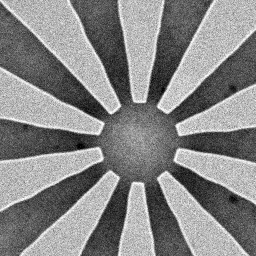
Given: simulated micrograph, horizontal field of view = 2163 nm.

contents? groups of lines, slits or small figures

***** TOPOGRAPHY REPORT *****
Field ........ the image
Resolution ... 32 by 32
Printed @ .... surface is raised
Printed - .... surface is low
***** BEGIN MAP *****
@@@@@@@@@------@@@@@------@@@@@@
-@@@@@@@@------@@@@@------@@@@@@
--@@@@@@@@-----@@@@@-----@@@@@@@
----@@@@@@-----@@@@@-----@@@@@@@
----@@@@@@@----@@@@@----@@@@@@@-
-----@@@@@@-----@@@@----@@@@@@--
------@@@@@@----@@@----@@@@@@---
-------@@@@@----@@@----@@@@@----
--------@@@@@---@@@---@@@@@-----
@@-------@@@@---@@@---@@@@------
@@@@------@@@@--@@@--@@@@-------
@@@@@@-----@@@--@@---@@@------@@
@@@@@@@-----@@@--@--@@@-----@@@@
@@@@@@@@@----@@-----@@----@@@@@@
@@@@@@@@@@@-------------@@@@@@@@
----@@@@@@@@@---------@@@@@@@@@@
---------@@@----------@@@-------
--------------------------------
--------------------------------
-----@@@@@@@@---------@@@@@@----
@@@@@@@@@@@@----------@@@@@@@@@@
@@@@@@@@@@--------------@@@@@@@@
@@@@@@@@----@@@-----@@----@@@@@@
@@@@@@------@@--@@--@@@-----@@@@
@@@@------@@@@--@@---@@@------@@
@@-------@@@@---@@---@@@@-------
--------@@@@@---@@----@@@@------
-------@@@@@----@@@---@@@@@-----
------@@@@@@---@@@@----@@@@@----
-----@@@@@@----@@@@----@@@@@@---
----@@@@@@@----@@@@----@@@@@@@--
---@@@@@@@-----@@@@-----@@@@@@@-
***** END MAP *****